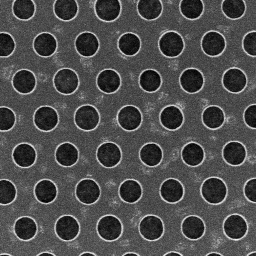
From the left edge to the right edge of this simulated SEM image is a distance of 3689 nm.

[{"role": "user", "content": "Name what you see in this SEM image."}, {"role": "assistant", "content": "a regular array of holes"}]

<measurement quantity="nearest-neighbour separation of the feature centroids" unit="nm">601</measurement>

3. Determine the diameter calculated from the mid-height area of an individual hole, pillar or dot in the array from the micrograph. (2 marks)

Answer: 339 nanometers